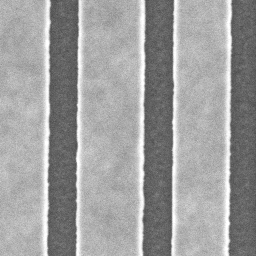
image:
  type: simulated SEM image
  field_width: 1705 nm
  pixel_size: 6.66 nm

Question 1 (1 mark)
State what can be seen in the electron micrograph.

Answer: lines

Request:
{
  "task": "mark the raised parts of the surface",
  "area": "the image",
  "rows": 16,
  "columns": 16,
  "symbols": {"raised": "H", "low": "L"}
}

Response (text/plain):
HHHLLHHHHLLHHHLL
HHHLLHHHHLLHHHLL
HHHLLHHHHLLHHHLL
HHHLLHHHHLLHHHLL
HHHLLHHHHLLHHHLL
HHHLLHHHHLLHHHLL
HHHLLHHHHLLHHHLL
HHHLLHHHHLLHHHLL
HHHLLHHHHLLHHHLL
HHHLLHHHHLLHHHLL
HHHLLHHHHLLHHHLL
HHHLLHHHHLLHHHLL
HHHLLHHHHLLHHHLL
HHHLLHHHHLLHHHLL
HHHLLHHHHLLHHHLL
HHHLLHHHHLLHHHLL